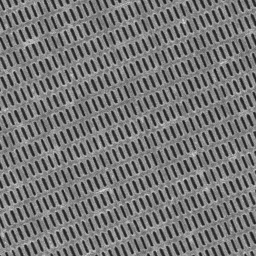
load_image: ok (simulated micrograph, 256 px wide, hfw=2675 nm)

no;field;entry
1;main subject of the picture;a regular array of holes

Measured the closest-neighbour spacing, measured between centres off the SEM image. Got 70.8 nanometers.